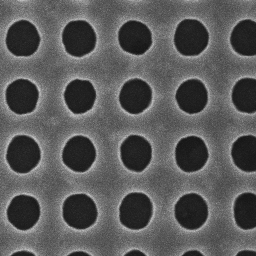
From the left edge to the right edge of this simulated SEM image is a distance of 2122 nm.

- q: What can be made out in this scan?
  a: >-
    a regular array of holes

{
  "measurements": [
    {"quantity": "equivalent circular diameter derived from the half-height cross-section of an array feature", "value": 35.2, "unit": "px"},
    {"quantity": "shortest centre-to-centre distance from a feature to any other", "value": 464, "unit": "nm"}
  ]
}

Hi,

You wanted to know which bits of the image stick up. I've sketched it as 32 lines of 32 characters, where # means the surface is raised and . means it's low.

################################
################################
#######################.########
#...####....###....###....###...
#....###....###....###....###...
#....###....###....###....###...
#...####...#####..####...####...
################################
################################
################################
#...#####..#####..#####..####...
#....###....###....###....###...
#....###....###....###....###...
#...#####..####...#####...####..
################################
################################
################################
#...#####..#####..####...#####..
#....###....###....###....###...
#....###....###....###....###...
#....###....###....###....###...
##..#############.#####.#######.
################################
################################
##..#####..#####...####..#####..
#....###....###....###....###...
#....###....###....###....###...
#....###....###....###....###...
##..#####..#####..#####..#####..
################################
################################
##..############..#####..#####..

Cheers